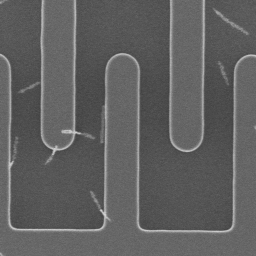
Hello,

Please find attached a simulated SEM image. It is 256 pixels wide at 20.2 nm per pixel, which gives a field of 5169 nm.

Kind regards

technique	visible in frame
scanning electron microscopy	groups of lines, slits or small figures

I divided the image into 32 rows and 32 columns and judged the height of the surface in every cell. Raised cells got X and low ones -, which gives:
-----XXXX------------XXXX-------
-----XXXX------------XXXX-------
-----XXXX------------XXXX-------
-----XXXX------------XXXX-------
-----XXXX------------XXXX-------
-----XXXX------------XXXX-------
-----XXXX------------XXXX-------
X----XXXX-----XXX----XXXX-----XX
X----XXXX----XXXX----XXXX----XXX
X----XXXX----XXXX----XXXX----XXX
X----XXXX----XXXX----XXXX----XXX
X----XXXX----XXXX----XXXX----XXX
X----XXXX----XXXX----XXXX----XXX
X----XXXX----XXXX----XXXX----XXX
X----XXXX----XXXX----XXXX----XXX
X----XXXX----XXXX----XXXX----XXX
X----XXXX----XXXX----XXXX----XXX
X----XXXX----XXXX----XXXX----XXX
X-----XX-----XXXX-----XXX----XXX
X------------XXXX------------XXX
X------------XXXX------------XXX
X------------XXXX------------XXX
X------------XXXX------------XXX
X------------XXXX------------XXX
X------------XXXX------------XXX
X------------XXXX------------XXX
X------------XXXX------------XXX
X------------XXXX------------XXX
XX----------XXXXXX-----------XXX
XXXXXXXXXXXXXXXXXXXXXXXXXXXXXXXX
XXXXXXXXXXXXXXXXXXXXXXXXXXXXXXXX
XXXXXXXXXXXXXXXXXXXXXXXXXXXXXXXX